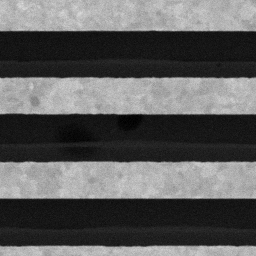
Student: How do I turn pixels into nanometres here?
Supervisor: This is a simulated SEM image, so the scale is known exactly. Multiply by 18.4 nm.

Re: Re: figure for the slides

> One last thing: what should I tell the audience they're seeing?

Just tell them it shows lines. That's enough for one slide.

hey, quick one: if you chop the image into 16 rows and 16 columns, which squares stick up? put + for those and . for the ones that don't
++++++++++++++++
++++++++++++++++
................
................
................
++++++++++++++++
++++++++++++++++
................
................
................
++++++++++++++++
++++++++++++++++
................
................
................
++++++++++++++++